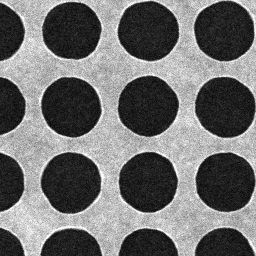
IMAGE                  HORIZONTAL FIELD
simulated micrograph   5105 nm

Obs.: holes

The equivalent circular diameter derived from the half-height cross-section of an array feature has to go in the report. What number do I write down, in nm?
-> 1210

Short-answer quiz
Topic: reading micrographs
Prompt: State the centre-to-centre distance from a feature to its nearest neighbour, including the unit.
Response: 1520 nanometers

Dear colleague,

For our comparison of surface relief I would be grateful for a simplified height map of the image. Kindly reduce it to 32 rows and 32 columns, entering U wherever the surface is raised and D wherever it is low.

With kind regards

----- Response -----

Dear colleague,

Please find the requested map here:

DUUUUUUDDDDUUUUUUDDDUUUUUUUDDDUU
DDUUUUDDDDDDUUUUDDDDDUUUUDDDDDDU
DDDUUUDDDDDDUUUDDDDDDDUUDDDDDDDD
DDDUUDDDDDDDDUUDDDDDDDUUDDDDDDDD
DDDUUDDDDDDDDUUDDDDDDDUUDDDDDDDD
DDDUUUDDDDDDUUUDDDDDDDUUUDDDDDDD
DDUUUUDDDDDDUUUUDDDDDUUUUDDDDDDU
DUUUUUUUUUUUUUUUUUDDUUUUUUUDDUUU
UUUUUUUUUUUUUUUUUUUUUUUUUUUUUUUU
UUUUUUUUUUUUUUUUUUDUUUUUUUUUUUUU
DDUUUUDDDDDUUUUUDDDDDUUUUDDDDDUU
DDDUUUDDDDDDUUUDDDDDDDUUUDDDDDDU
DDDUUDDDDDDDDUUDDDDDDDUUDDDDDDDD
DDDUUDDDDDDDDUUDDDDDDDUUDDDDDDDD
DDDUUDDDDDDDDUUDDDDDDDUUUDDDDDDD
DDUUUUDDDDDDUUUDDDDDDDUUUDDDDDDU
DUUUUUUDDDDUUUUUUDDDDUUUUUDDDDDU
UUUUUUUUUUUUUUUUUUUUUUUUUUUUUUUU
UUUUUUUUUUUUUUUUUUUUUUUUUUUUUUUU
DUUUUUUDDDDUUUUUUDDDUUUUUUDDDDUU
DDUUUUDDDDDDUUUUDDDDDDUUUDDDDDDU
DDDUUDDDDDDDUUUDDDDDDDUUUDDDDDDD
DDDUUDDDDDDDDUUDDDDDDDUUDDDDDDDD
DDDUUDDDDDDDDUUDDDDDDDUUUDDDDDDD
DDDUUUDDDDDDUUUDDDDDDDUUUDDDDDDU
DDUUUUDDDDDUUUUUDDDDDUUUUUDDDDDU
UUUUUUUDDDUUUUUUUUDUUUUUUUUUDUUU
UUUUUUUUUUUUUUUUUUUUUUUUUUUUUUUU
UUUUUUUUUUUUUUUUUUUUUUUUUUUUDUUU
DDUUUUDDDDDDUUUUDDDDDUUUUDDDDDDU
DDDUUDDDDDDDUUUDDDDDDDUUUDDDDDDU
DDDUUDDDDDDDDUUDDDDDDDUUDDDDDDDD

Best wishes